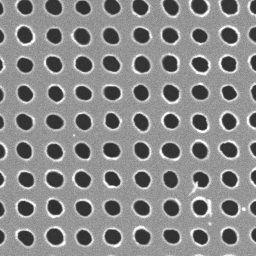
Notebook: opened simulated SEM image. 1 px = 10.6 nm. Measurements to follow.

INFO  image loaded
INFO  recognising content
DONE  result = a regular array of holes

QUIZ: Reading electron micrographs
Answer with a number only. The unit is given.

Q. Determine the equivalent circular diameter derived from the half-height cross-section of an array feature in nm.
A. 165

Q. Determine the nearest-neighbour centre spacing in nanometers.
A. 299